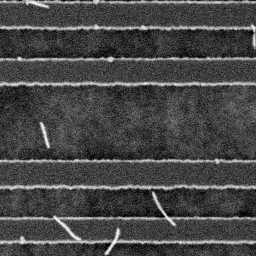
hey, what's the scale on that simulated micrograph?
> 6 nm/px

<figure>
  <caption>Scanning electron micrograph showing lines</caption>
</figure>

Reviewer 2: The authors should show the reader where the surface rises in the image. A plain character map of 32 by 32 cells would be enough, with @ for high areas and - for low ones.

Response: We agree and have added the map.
@@@@@@@@@@@@@@@@@@@@@@@@@@@@@@@@
@@@@@@@@@@@@@@@@@@@@@@@@@@@@@@@@
@@@@@@@@@@@@@@@@@@@@@@@@@@@@@@@@
@@@@@@@@@@@@@@@@@@@@@@@@@@@@@@@@
--------------------------------
--------------------------------
--------------------------------
@@@@@@@@@@@@@@@@@@@@@@@@@@@@@@@@
@@@@@@@@@@@@@@@@@@@@@@@@@@@@@@@@
@@@@@@@@@@@@@@@@@@@@@@@@@@@@@@@@
@@@@@@@@@@@@@@@@@@@@@@@@@@@@@@@@
--------------------------------
--------------------------------
--------------------------------
--------------------------------
--------------------------------
--------------------------------
--------------------------------
--------------------------------
--------------------------------
@@@@@@@@@@@@@@@@@@@@@@@@@@@@@@@@
@@@@@@@@@@@@@@@@@@@@@@@@@@@@@@@@
@@@@@@@@@@@@@@@@@@@@@@@@@@@@@@@@
@@-@--@-@@@@@@@@--@-@@---@-@---@
--------------------------------
--------------------------------
--------------------------------
@@@@@@@@@@@@@@@@@@@@@@@@@@@@@@@@
@@@@@@@@@@@@@@@@@@@@@@@@@@@@@@@@
@@@@@@@@@@@@@@@@@@@@@@@@@@@@@@@@
--------------------------------
--------------------------------